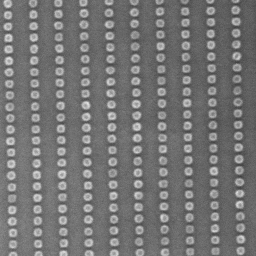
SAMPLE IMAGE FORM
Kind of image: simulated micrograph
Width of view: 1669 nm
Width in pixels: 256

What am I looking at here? a regular array of raised bodies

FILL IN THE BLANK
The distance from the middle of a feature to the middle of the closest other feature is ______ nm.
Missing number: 72.8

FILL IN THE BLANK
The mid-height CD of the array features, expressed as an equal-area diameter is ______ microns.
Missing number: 0.0493